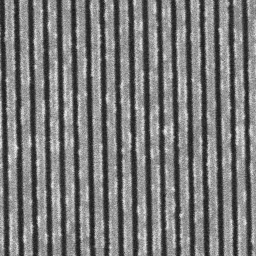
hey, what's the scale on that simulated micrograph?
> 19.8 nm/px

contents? parallel lines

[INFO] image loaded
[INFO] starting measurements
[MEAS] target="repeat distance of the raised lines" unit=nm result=282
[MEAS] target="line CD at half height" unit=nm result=151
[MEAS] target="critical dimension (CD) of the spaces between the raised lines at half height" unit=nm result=118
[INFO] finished